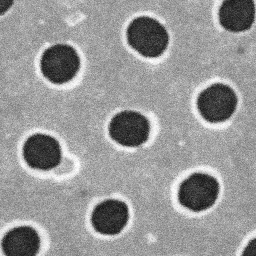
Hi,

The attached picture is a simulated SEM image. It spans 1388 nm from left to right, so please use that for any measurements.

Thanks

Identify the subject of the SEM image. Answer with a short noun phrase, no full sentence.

holes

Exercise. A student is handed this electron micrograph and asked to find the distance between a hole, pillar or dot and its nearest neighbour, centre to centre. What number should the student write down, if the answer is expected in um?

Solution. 0.49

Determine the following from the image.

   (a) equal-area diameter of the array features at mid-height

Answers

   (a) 224 nm